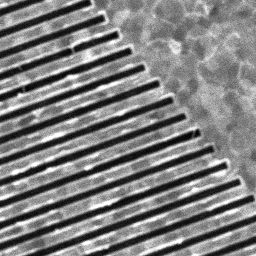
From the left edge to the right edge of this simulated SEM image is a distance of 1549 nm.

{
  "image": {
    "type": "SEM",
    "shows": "parallel lines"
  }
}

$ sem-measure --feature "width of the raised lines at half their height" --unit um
0.0697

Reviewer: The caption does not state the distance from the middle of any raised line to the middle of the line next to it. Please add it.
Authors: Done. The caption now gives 20 px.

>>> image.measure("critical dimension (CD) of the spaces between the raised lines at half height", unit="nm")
49.8